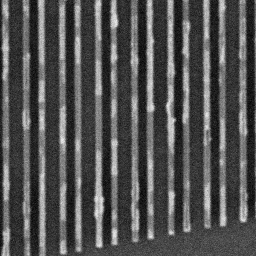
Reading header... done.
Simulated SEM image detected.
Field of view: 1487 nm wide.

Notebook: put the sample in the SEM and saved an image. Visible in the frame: parallel lines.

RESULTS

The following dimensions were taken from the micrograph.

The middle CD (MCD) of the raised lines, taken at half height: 30.5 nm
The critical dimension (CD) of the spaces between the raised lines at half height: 0.0857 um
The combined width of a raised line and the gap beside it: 106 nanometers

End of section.